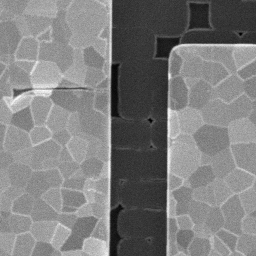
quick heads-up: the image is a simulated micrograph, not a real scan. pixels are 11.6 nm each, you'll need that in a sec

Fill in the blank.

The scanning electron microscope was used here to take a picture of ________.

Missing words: wiring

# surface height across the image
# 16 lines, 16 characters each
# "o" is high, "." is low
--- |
ooooooo.........
ooooooo.........
ooooooo.........
ooooooo....ooooo
ooooooo....ooooo
ooooooo....ooooo
ooooooo....ooooo
ooooooo....ooooo
ooooooo....ooooo
ooooooo....ooooo
ooooooo....ooooo
ooooooo....ooooo
ooooooo...oooooo
ooooooo...oooooo
ooooooo...oooooo
ooooooo...oooooo